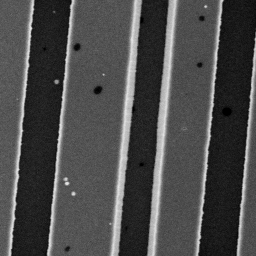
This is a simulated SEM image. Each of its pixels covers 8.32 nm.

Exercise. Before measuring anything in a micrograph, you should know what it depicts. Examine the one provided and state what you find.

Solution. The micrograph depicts lines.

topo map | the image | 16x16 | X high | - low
XX--XXXXX--XXX--
XX--XXXX---XXX--
XX--XXXX---XXX--
XX--XXXX---XXX--
XX--XXXX--XXX---
XX--XXXX--XXX---
X---XXXX--XXX---
X---XXXX--XXX---
X---XXXX--XXX--X
X---XXXX--XXX--X
X---XXXX--XXX--X
X--XXXXX--XXX--X
X--XXXX---XXX--X
X--XXXX---XXX--X
X--XXXX---XXX--X
X--XXXX---XX---X